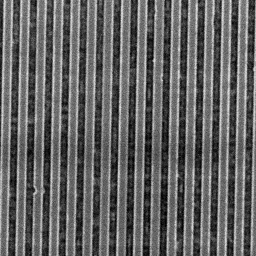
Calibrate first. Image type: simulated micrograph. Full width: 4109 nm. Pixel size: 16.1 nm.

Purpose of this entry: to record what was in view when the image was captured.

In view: parallel lines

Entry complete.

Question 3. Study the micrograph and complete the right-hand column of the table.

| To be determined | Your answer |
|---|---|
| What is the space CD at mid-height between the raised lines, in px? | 8.37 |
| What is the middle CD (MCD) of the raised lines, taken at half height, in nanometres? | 136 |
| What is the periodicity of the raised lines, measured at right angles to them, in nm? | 269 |